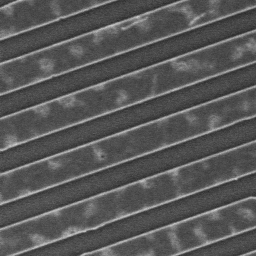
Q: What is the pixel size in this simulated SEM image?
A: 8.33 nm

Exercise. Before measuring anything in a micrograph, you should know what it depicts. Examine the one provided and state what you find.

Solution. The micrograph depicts parallel lines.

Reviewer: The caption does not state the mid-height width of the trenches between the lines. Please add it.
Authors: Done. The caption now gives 184 nanometers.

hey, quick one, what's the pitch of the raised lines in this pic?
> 431 nanometres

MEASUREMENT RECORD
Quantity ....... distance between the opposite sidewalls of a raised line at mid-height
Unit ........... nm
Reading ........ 246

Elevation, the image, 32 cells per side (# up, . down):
.############........###########
##########.........###########..
#######.........###########.....
####.........###########........
#.........###########.........##
.......############........#####
....############........########
.############........###########
##########........############..
#######........############.....
####.........###########........
#........############.........##
.......###########.........#####
....###########.........########
.############........###########
##########........###########...
#######........###########......
####........###########.........
#........###########.........###
.......###########........######
....###########........#########
.###########.........###########
#########.........###########...
######.........###########......
###.........###########.........
.........###########.........###
......###########.........######
...###########.........#########
############........############
#########........############...
######........############......
###........############........#